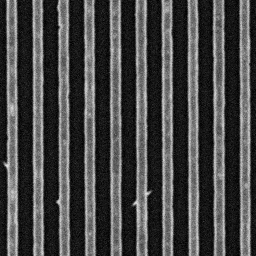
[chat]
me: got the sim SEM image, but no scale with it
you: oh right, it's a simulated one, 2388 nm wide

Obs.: parallel lines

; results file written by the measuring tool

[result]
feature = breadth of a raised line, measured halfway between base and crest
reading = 8.87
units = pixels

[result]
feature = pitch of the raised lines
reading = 241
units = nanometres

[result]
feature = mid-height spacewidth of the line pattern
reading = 156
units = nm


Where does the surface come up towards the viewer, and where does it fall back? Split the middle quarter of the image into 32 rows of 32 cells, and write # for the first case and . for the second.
#....##.....##....###....##....#
#....##.....##....###....##....#
#....##.....##....###....##....#
#....##.....##....##.....##....#
#....###....##....##.....##....#
#....###....##....##.....##....#
#....###....##....###....##....#
#....##.....##....###....##....#
#....##.....##....###....##....#
#....##.....##....###....##....#
#.....#.....##....###....##....#
#....##.....##....###....##....#
#....##.....##....###....##....#
#....##.....##....##.....##....#
#....##.....##....##.....##....#
#....##.....##....##.....##....#
#....##.....##....###....##....#
#....###....##....###....##....#
#....###....##....###....##....#
#....###....##....##.....##....#
#....##.....##....##.....##....#
#....##.....##....##.....##....#
#....##.....##....##.....##....#
#....##.....##....###....##....#
#....##.....##....###....##....#
#....##.....##....###....##....#
#....##.....##....##.....##....#
#....##.....##....##.....##....#
#....##.....##....##.....##....#
#....##.....##....##.....##....#
#....##.....##....##.....##....#
#....##.....##....##.....##....#